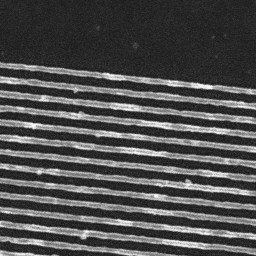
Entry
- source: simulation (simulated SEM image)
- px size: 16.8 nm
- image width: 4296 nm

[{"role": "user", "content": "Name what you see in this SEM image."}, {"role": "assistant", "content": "parallel lines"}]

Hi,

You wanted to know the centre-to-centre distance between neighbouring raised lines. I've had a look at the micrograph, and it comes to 242 nanometers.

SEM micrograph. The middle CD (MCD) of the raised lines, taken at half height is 75.1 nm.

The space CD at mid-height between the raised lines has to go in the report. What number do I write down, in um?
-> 0.163